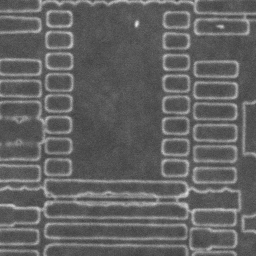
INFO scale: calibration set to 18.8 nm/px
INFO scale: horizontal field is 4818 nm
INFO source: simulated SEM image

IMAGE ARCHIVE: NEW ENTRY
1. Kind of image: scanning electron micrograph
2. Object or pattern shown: wiring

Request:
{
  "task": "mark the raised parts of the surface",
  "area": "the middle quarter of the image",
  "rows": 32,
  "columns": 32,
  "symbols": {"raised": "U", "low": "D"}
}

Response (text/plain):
UUDDDDDDDDDDDDDDDDDDDDDDDUUUUUUD
DDDDDDDDDDDDDDDDDDDDDDDDDDDDDDDD
UDDDDDDDDDDDDDDDDDDDDDDDDDDDDDDD
UUDDDDDDDDDDDDDDDDDDDDDDDUUUUUUD
UUDDDDDDDDDDDDDDDDDDDDDDDUUUUUUD
UUDDDDDDDDDDDDDDDDDDDDDDDUUUUUUD
UUDDDDDDDDDDDDDDDDDDDDDDDUUUUUUD
DDDDDDDDDDDDDDDDDDDDDDDDDDDDDDDD
UUDDDDDDDDDDDDDDDDDDDDDDDUUUUUUD
UUDDDDDDDDDDDDDDDDDDDDDDDUUUUUUD
UUDDDDDDDDDDDDDDDDDDDDDDDUUUUUUD
UUDDDDDDDDDDDDDDDDDDDDDDDUUUUUUD
DDDDDDDDDDDDDDDDDDDDDDDDDDDDDDDD
UDDDDDDDDDDDDDDDDDDDDDDDDDDDDDDD
UUDDDDDDDDDDDDDDDDDDDDDDDUUUUUUD
UUDDDDDDDDDDDDDDDDDDDDDDDUUUUUUD
UUDDDDDDDDDDDDDDDDDDDDDDDUUUUUUD
DDDDDDDDDDDDDDDDDDDDDDDDDDDDDDDD
DDDDDDDDDDDDDDDDDDDDDDDDDDDDDDDD
UUDDDDDDDDDDDDDDDDDDDDDDDUUUUUUD
UUDDDDDDDDDDDDDDDDDDDDDDDUUUUUUD
UUDDDDDDDDDDDDDDDDDDDDDDDUUUUUUD
DDDDDDDDDDDDDDDDDDDDDDDDDUUUUUUD
DDDDDDDDDDDDDDDDDDDDDDDDDDDDDDDD
UUDDDDDDDDDDDDDDDDDDDDDDDUUUUUUD
UUDDDDDDDDDDDDDDDDDDDDDDDUUUUUUD
UUDDDDDDDDDDDDDDDDDDDDDDDUUUUUUD
UDDDDDDDDDDDDDDDDDDDDDDDDUUUUUUD
DDDDDDDDDDDDDDDDDDDDDDDDDDDDDDDD
UUUUUUUUUUUUUUUUUUUUUUUUDDDDDDDD
UUUUUUUUUUUUUUUUUUUUUUUUUUUUUUUD
UUUUUUUUUUUUUUUUUUUUUUUUUUUUUUUD